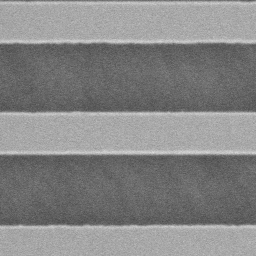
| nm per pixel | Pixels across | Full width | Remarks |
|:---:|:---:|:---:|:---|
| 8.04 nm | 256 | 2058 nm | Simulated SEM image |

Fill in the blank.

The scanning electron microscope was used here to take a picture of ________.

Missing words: lines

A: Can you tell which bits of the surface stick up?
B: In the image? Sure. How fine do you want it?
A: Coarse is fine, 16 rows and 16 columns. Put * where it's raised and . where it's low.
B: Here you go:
****************
****************
****************
................
................
................
................
****************
****************
****************
................
................
................
................
****************
****************